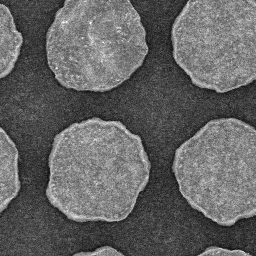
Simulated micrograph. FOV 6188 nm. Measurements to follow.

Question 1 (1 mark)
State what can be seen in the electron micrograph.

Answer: raised bodies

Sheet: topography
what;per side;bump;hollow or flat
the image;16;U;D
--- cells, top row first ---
DDDDUUUUDDDDUUUU
UDDUUUUUUDDUUUUU
UDDUUUUUUDDUUUUU
UDDUUUUUUDDUUUUU
DDDUUUUUDDDDUUUU
DDDDDUUDDDDDDUUD
DDDDDDDDDDDDDDDD
DDDDDDDDDDDDDDUD
DDDDUUUUDDDDUUUU
UDDUUUUUUDDUUUUU
UDDUUUUUUDDUUUUU
UDDUUUUUUDDUUUUU
UDDUUUUUUDDDUUUU
DDDDUUUUDDDDDUUD
DDDDDDDDDDDDDDDD
DDDDDDDDDDDDDDDD